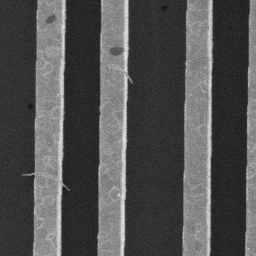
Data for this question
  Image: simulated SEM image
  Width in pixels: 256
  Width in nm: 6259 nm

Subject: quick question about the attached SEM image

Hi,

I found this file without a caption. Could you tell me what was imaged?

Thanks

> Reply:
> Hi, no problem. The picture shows lines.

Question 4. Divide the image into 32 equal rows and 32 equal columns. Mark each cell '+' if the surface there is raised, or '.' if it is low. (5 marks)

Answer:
.....+++.....+++.......+++.....+
.....+++.....+++.......+++.....+
.....+++.....+++.......+++.....+
.....+++.....+++.......+++.....+
.....+++.....+++.......+++.....+
.....+++.....+++.......+++.....+
.....+++.....+++.......+++.....+
.....+++.....+++.......+++.....+
.....+++.....+++.......+++.....+
.....+++.....+++.......+++.....+
.....+++.....+++.......+++.....+
.....+++.....+++.......+++.....+
.....+++.....+++.......+++.....+
.....+++.....+++.......+++.....+
....++++.....+++.......+++.....+
....++++.....+++.......+++.....+
....++++.....+++.......+++.....+
....++++.....+++.......+++.....+
....++++.....+++.......+++.....+
....++++.....+++.......+++.....+
....++++....++++.......+++.....+
....++++....++++.......+++.....+
....++++....++++.......+++.....+
....++++....++++.......+++.....+
....++++....++++.......+++.....+
....++++....++++.......+++.....+
....++++....++++.......+++.....+
....++++....++++.......+++.....+
....++++....++++.......+++.....+
....+++.....+++........+++.....+
....+++.....+++........+++.....+
....+++.....+++........+++.....+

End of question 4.